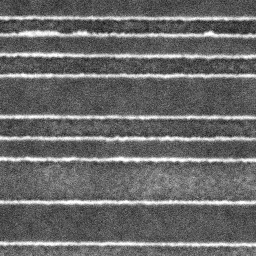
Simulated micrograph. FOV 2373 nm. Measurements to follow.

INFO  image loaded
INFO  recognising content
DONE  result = lines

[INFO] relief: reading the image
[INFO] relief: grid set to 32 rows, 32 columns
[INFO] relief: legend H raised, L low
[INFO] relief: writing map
HHHHHHHHHHHHHHHHHHHHHHHHHHHHHHHH
HHHHHHHHHHHHHHHHHHHHHHHHHHHHHHHH
LLLLLLLLLLLLLLLLLLLLLLLLLLLLLLLL
LLLLLLLLLLLLLLLLLLLLLLLLLLLLLLLL
HHHHHHHHHHHHHHHHHHHHHHHHHHHHHHHH
HHHHHHHHHHHHHHHHHHHHHHHHHHHHHHHH
HHHHHHHHHHHHHHHHHHHHHHHHHHHHHHHH
LLLLLLLLLLLLLLLLLLLLLLLLLLLLLLLL
LLLLLLLLLLLLLLLLLLLLLLLLLLLLLLLL
HHHHHHHHHHHHHHHHHHHHHHHHHHHHHHHH
HHHHHHHHHHHHHHHHHHHHHHHHHHHHHHHH
HHHHHHHHHHHHHHHHHHHHHHHHHHHHHHHH
HHHHHHHHHHHHHHHHHHHHHHHHHHHHHHHH
HHHHHHHHHHHHHHHHHHHHHHHHHHHHHHHH
HHHHHHHHHHHHHHHHHHHHHHHHHHHHHHHH
LLLLLLLLLLLLLLLLLLLLLLLLLLLLLLLL
LLLLLLLLLLLLLLLLLLLLLLLLLLLLLLLL
HHHHHHHHHHHHHHHHHHHHHHHHHHHHHHHH
HHHHHHHHHHHHHHHHHHHHHHHHHHHHHHHH
HHHHHHHHHHHHHHHHHHHHHHHHHHHHHHHH
LLLLLLLLLLLLLLLLLLLLLLLLLLLLLLLL
LLLLLLLLLLLLLLLLLLLLLLLLLLLLLLLL
LLLLLLLLLLLLLLLLLLLLLLLLLLLLLLLL
LLLLLLLLLLLLLLLLLLLLLLLLLLLLLLLL
LLLLLLLLLLLLLLLLLLLLLLLLLLLLLLLL
HHHHHHHHHHHHHHHHHHHHHHHHHHHHHHHH
HHHHHHHHHHHHHHHHHHHHHHHHHHHHHHHH
HHHHHHHHHHHHHHHHHHHHHHHHHHHHHHHH
HHHHHHHHHHHHHHHHHHHHHHHHHHHHHHHH
HHHHHHHHHHHHHHHHHHHHHHHHHHHHHHHH
HHHHHHHHHHHHHHHHHHHHHHHHHHHHHHHH
LLLLLLLLLLLLLLLLLLLLLLLLLLLLLLLL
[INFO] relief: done